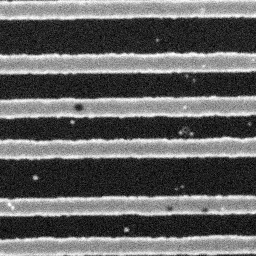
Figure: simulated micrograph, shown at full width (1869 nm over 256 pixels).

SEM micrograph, lines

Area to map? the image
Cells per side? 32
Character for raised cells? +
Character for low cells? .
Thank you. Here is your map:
++++++++++++++++++++++++++++++++
++++++++++++++++++++++++++++++++
................................
................................
................................
................................
................................
++++++++++++++++++++++++++++++++
++++++++++++++++++++++++++++++++
................................
................................
................................
..++++++++++++++++++++++++++++++
++++++++++++++++++++++++++++++++
+++++++++++++++++.++.+++++......
................................
................................
............+..++++++.++++++++++
++++++++++++++++++++++++++++++++
++++++++++++++++++++++++++++++++
................................
................................
................................
................................
................................
++++++++++++++++++++++++++++++++
++++++++++++++++++++++++++++++++
................................
................................
..........................++++..
++++++++++++++++++++++++++++++++
++++++++++++++++++++++++++++++++